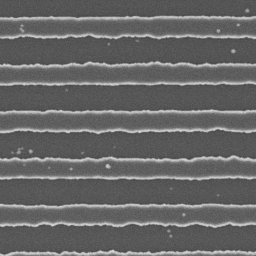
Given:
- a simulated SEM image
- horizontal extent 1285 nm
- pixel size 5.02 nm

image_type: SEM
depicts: lines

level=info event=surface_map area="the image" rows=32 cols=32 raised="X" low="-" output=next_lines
--------------------------------
--------------------------------
XXXXXXXXXXXXXXXXXXXXXXXXXXXXXXXX
XXXXXXXXXXXXXXXXXXXXXXXXXXXXXXXX
XXXXXXXXXX--XXXXXXXXXXXXXXXXXXXX
--------------------------------
--------------------------------
--------------------------------
XXXXXXXXXXXXXXXXXXXXXXXXXXXXXXXX
XXXXXXXXXXXXXXXXXXXXXXXXXXXXXXXX
XX----XX-----XX-------X---------
--------------------------------
--------------------------------
--------------------------------
XXXXXXXXXXXXXXXXXXXXXXXXXXXXXXXX
XXXXXXXXXXXXXXXXXXXXXXXXXXXXXXXX
X-------X--XX---X-------------X-
--------------------------------
--------------------------------
--------------------------------
XXXXXXXXXXXXXXXXXXXXXXXXXXXXXXXX
XXXXXXXXXXXXXXXXXXXXXXXXXXXXXXXX
--------------------------------
--------------------------------
--------------------------------
--------------------------------
XXXXXXXXXXXXXXXXXXXXXXXXXXXXXXXX
XXXXXXXXXXXXXXXXXXXXXXXXXXXXXXXX
--------------------------------
--------------------------------
--------------------------------
--------X---XXX-X---XXXXXXXXXXXX